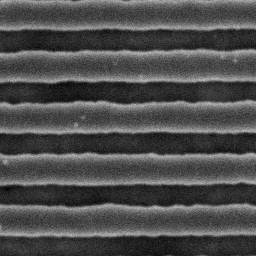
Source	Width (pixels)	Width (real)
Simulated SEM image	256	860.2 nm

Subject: lines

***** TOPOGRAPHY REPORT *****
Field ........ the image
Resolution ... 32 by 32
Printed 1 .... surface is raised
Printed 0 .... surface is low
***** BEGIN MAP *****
11111111111111111111111111111111
11111111111111111111111111111111
11111111111111111111111111111111
11111111111111111111111111111111
00000000000000000000000000000000
00000000000000000000000000000000
00111110001111111111111111111111
11111111111111111111111111111111
11111111111111111111111111111111
11111111111111111111111111111111
00000000000000000000000000000000
00000000000000000000000000000000
00000000000000000000000000000000
11111111111111111111111111111111
11111111111111111111111111111111
11111111111111111111111111111111
11111111111111011110010011111101
00000000000000000000000000000000
00000000000000000000000000000000
10111111111111111111111111111111
11111111111111111111111111111111
11111111111111111111111111111111
11111111111111111111111111111111
00000000000000000000000000000000
00000000000000000000000000000000
00000000000001000000000000000000
11111111111111111111111111111111
11111111111111111111111111111111
11111111111111111111111111111111
00000000111000000000000000000000
00000000000000000000000000000000
00000000000000000000000000000000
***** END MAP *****